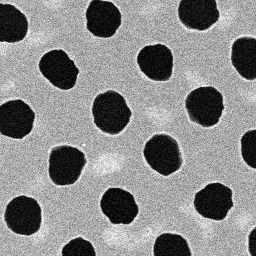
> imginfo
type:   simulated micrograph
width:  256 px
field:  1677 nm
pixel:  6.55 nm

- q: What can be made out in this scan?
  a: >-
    a regular array of holes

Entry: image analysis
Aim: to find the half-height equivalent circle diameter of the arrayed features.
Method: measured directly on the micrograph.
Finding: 252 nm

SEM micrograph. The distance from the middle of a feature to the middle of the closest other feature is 432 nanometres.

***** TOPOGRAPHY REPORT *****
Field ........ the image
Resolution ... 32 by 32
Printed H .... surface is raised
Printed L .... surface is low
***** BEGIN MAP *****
LHHHHHHHHHHLLLHHHHHHHHLLLLLHHHHH
LLLHHHHHHHHLLLLHHHHHHHLLLLLHHHHH
LLLHHHHHHHHLLLLHHHHHHHHLLLLHHHHH
LLLHHHHHHHHLLLLHHHHHHHHHLLHHHHHH
LLLHHHHHHHHHLLHHHHHHHHHHHHHHHHHH
HHHHHHHHHHHHHHHHHHHHHHHHHHHHHLLL
HHHHHHLLHHHHHHHHHLLLLHHHHHHHHLLL
HHHHHLLLLHHHHHHHHLLLLLHHHHHHHLLL
HHHHHLLLLLHHHHHHHLLLLLHHHHHHHLLL
HHHHHHLLLLHHHHHHHHLLLHHHHHHHHHLL
HHHHHHHLLHHHHHHHHHHHHHHHHHHHHHHH
HHHHHHHHHHHHHLLHHHHHHHHHLLLHHHHH
HHHHHHHHHHHHLLLLHHHHHHHLLLLLHHHH
LLLLHHHHHHHHLLLLHHHHHHHLLLLLHHHH
LLLLHHHHHHHHLLLLHHHHHHHHLLLLHHHH
LLLLHHHHHHHHLLLLHHHHHHHHHLLHHHHH
LLLLHHHHHHHHHLLHHHHHHHHHHHHHHHHL
HHHHHHHHHHHHHHHHHHHLLLHHHHHHHHLL
HHHHHHHLLLHHHHHHHHLLLLHHHHHHHHLL
HHHHHHLLLLLHHHHHHHLLLLHHHHHHHHLL
HHHHHHLLLLLHHHHHHHHLLLLHHHHHHHHL
HHHHHHLLLLHHHHHHHHHHLLHHHHHHHHHH
HHHHHHLLLLHHHHHHHHHHHHHHHHHHHHHH
HHHHHHHHHHHHHHLHHHHHHHHHHLLLLHHH
HHLHHHHHHHHHHLLLLHHHHHHHLLLLLHHH
HLLLLHHHHHHHHLLLLHHHHHHHLLLLLHHH
HLLLLHHHHHHHHLLLLHHHHHHHHLLLLHHH
HLLLLHHHHHHHHHLLLHHHHHHHHHHHHHHH
HLLLLHHHHHHHHHHHHHHHHHHHHHHHHHHH
HHHHHHHHHHHHHHHHHHHHLLLHHHHHHHHL
HHHHHHHHLLLHHHHHHHHLLLLHHHHHHHHL
HHHHHHHHLLLLHHHHHHHLLLLLHHHHHHHL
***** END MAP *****